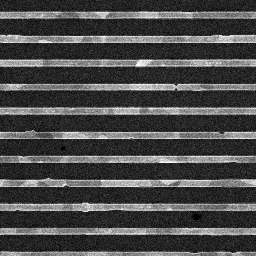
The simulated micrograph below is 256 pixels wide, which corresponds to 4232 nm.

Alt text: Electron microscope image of parallel lines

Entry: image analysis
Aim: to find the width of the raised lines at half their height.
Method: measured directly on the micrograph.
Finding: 97.1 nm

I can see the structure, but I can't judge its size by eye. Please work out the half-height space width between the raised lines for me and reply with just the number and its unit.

291 nanometres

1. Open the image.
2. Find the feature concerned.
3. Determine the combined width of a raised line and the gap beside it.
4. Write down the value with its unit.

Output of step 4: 397 nanometers